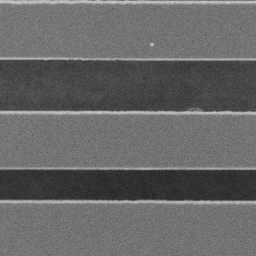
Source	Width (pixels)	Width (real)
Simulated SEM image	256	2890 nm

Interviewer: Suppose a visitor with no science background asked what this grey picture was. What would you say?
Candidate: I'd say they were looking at lines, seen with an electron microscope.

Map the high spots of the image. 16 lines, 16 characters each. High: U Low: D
UUUUUUUUUUUUUUUU
UUUUUUUUUUUUUUUU
UUUUUUUUUUUUUUUU
UUUUUUUUUUUUUUUU
DDDDDDDDDDDDDDDD
DDDDDDDDDDDDDDDD
DDDDDDDDDDDDDDDD
UUUUUUUUUUUUUUUU
UUUUUUUUUUUUUUUU
UUUUUUUUUUUUUUUU
UUUUUUUUUUUUUUUU
DDDDDDDDDDDDDDDD
DDDDDDDDDDDDDDDD
UUUUUUUUUUUUUUUU
UUUUUUUUUUUUUUUU
UUUUUUUUUUUUUUUU